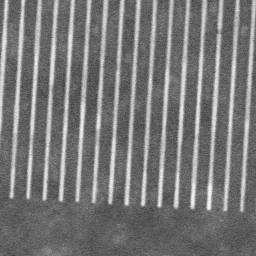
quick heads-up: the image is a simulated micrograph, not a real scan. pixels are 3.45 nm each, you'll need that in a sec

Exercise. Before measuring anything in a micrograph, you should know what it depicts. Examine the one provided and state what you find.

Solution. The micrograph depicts parallel lines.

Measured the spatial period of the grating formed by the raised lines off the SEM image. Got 0.0569 micrometres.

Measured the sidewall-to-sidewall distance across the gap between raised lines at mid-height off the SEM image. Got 48.7 nm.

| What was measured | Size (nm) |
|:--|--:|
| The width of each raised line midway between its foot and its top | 9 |